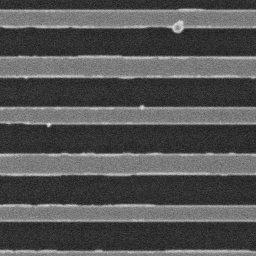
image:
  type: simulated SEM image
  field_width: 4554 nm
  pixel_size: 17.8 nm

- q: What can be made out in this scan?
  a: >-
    lines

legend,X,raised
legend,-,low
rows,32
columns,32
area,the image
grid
--------------------------------
XXXXXXXXXXXXXXXXXXXXXXXXXXXXXXXX
XXXXXXXXXXXXXXXXXXXXXXXXXXXXXXXX
---------------------XX---------
--------------------------------
--------------------------------
--------------------------------
XXXXXXXXXXXXXXXXXXXXXXXXXXXXXXXX
XXXXXXXXXXXXXXXXXXXXXXXXXXXXXXXX
XXXXXXXXXXXXXXXXXXXXXXXXXXXXXXXX
--------------------------------
--------------------------------
--------------------------------
XXXXXXXXXXXXXXXXXXXXXXXXXXXXXXXX
XXXXXXXXXXXXXXXXXXXXXXXXXXXXXXXX
-----XX-------------------------
--------------------------------
--------------------------------
--------------------------------
XXXXXXXXXXXXXXXXXXXXXXXXXXXXXXXX
XXXXXXXXXXXXXXXXXXXXXXXXXXXXXXXX
XXXXXXXXXXXXXXXXXXXXXXXXXXXXXXXX
--------------------------------
--------------------------------
--------------------------------
--------------------------------
XXXXXXXXXXXXXXXXXXXXXXXXXXXXXXXX
XXXXXXXXXXXXXXXXXXXXXXXXXXXXXXXX
--------------------------------
--------------------------------
--------------------------------
XXXXXXXXXXXXXXXXXXXXXXXXXXXXXXXX